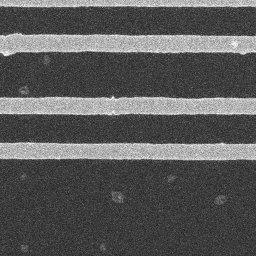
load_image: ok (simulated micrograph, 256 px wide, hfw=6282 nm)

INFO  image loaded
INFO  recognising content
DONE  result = parallel lines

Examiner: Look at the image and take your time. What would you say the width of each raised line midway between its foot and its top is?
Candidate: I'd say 383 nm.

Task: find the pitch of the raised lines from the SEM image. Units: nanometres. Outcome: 1320